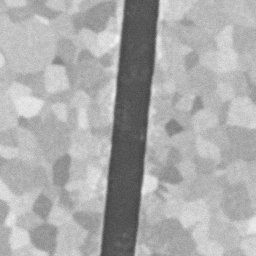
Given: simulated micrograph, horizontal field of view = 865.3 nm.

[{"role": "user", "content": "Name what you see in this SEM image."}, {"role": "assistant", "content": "one or a few lines or trenches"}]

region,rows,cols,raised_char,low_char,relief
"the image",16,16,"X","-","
XXXXXXXX--XXXXXX
XXXXXXXX--XXXXXX
XXXXXXXX--XXXXXX
XXXXXXX---XXXXXX
XXXXXXX---XXXXXX
XXXXXXX---XXXXXX
XXXXXXX--XXXXXXX
XXXXXXX--XXXXXXX
XXXXXXX--XXXXXXX
XXXXXXX--XXXXXXX
XXXXXXX--XXXXXXX
XXXXXXX--XXXXXXX
XXXXXXX--XXXXXXX
XXXXXX---XXXXXXX
XXXXXX---XXXXXXX
XXXXXX---XXXXXXX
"